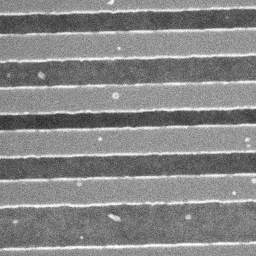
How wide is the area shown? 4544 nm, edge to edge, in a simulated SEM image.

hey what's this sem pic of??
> lines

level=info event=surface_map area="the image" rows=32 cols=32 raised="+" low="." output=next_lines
++++++++++++++++++++++++++++++++
+++++++++++++++.................
................................
................................
++++++++++++++++++++++++++++++++
++++++++++++++++++++++++++++++++
++++++++++++++++++++++++++++++++
+++++++++.+.....................
................................
................................
....................++++++++++++
++++++++++++++++++++++++++++++++
++++++++++++++++++++++++++++++++
+++++++++++++++++++++++++++++++.
................................
................................
++++++++++++++++++++++++++++++++
++++++++++++++++++++++++++++++++
++++++++++++++++++++++++++++++++
+++++++++.......................
................................
................................
..++++++++++++++++++++++++++++++
++++++++++++++++++++++++++++++++
++++++++++++++++++++++++++++++++
++++++++++++++++++++.+..........
................................
................................
................................
................................
..........................++++++
++++++++++++++++++++++++++++++++